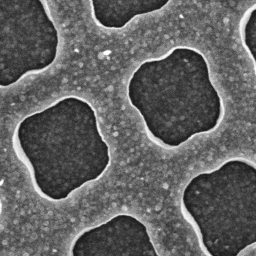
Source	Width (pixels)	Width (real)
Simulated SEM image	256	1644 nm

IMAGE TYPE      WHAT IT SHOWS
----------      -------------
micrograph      holes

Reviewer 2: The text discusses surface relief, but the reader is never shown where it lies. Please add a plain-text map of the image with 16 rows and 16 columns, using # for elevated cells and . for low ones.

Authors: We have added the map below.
...###....######
...###..#######.
....###########.
...#######...###
..######.....###
########.....###
###..###......##
##....###.....##
#.....####..####
#......#########
##.....#######..
##...#######....
###########.....
#######.####....
#####....####...
#####.....###..#